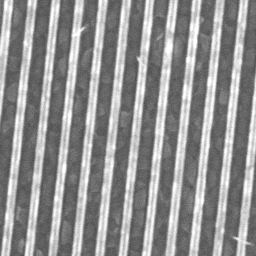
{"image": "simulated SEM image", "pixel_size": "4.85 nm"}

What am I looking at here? parallel lines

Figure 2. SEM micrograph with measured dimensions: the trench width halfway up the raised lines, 76.5 nanometres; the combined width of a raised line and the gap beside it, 113 nanometers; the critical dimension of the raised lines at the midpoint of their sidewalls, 7.81 px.